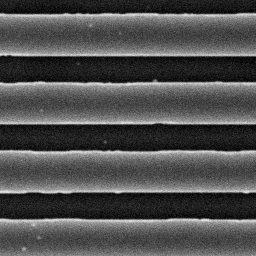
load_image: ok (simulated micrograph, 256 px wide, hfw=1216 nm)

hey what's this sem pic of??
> lines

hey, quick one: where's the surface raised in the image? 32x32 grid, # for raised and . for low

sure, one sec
................................
................................
################################
################################
################################
################################
################################
................................
................................
................................
################################
################################
################################
################################
################################
................................
................................
................................
................................
################################
################################
################################
################################
################################
................................
................................
................................
#.....####...........#####......
################################
################################
################################
################################